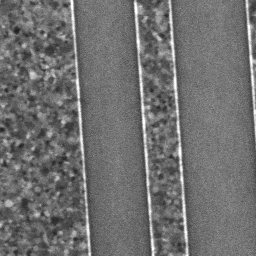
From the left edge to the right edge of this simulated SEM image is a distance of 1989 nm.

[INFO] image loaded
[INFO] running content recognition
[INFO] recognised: one or a few lines or trenches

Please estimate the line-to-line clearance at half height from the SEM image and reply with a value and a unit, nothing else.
488 nm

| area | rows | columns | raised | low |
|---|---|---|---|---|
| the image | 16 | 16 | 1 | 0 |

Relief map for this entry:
1111100011100001
1111100001100000
1111100001100000
1111100001100000
1111100001100000
1111100001100000
1111100001100000
1111100001100000
1111100001100000
1111100001100000
1111100001100000
1111100001100000
1111100001100000
1111100001110000
1111110001110000
1111110000110000